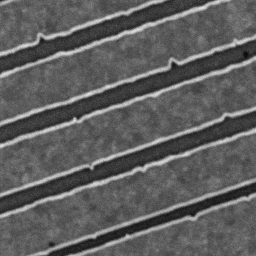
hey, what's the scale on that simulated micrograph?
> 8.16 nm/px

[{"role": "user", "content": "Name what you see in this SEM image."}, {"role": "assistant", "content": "one or a few lines or trenches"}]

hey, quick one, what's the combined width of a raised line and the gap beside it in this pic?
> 549 nm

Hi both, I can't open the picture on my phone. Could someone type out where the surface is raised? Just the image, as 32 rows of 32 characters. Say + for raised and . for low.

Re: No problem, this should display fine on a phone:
++++++++++++++++++........++++++
++++++++++++++++........++++++++
+++++++++++++........+++++++++++
++++++++++........++++++++++++++
+++++++........+++++++++++++++++
++++........+++++++++++++++++...
+........+++++++++++++++++......
......+++++++++++++++++........+
...++++++++++++++++++........+++
++++++++++++++++++........++++++
+++++++++++++++........+++++++++
++++++++++++........++++++++++++
+++++++++........+++++++++++++++
++++++........++++++++++++++++++
+++........+++++++++++++++++....
.........+++++++++++++++++......
.....++++++++++++++++++.........
..++++++++++++++++++.........+++
+++++++++++++++++........+++++++
++++++++++++++........++++++++++
++++++++++++.......+++++++++++++
+++++++++........+++++++++++++++
++++++........++++++++++++++++++
+++.......+++++++++++++++++++...
........++++++++++++++++++......
....+++++++++++++++++++.....++++
..++++++++++++++++++......++++++
+++++++++++++++++......+++++++++
++++++++++++++......++++++++++++
++++++++++++.....+++++++++++++++
++++++++......++++++++++++++++++
++++++.....+++++++++++++++++++++